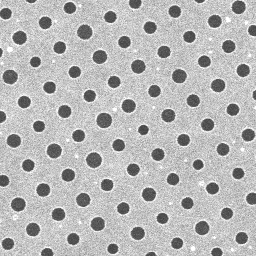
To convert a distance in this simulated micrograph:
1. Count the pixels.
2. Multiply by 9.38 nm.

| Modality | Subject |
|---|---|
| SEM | a regular array of holes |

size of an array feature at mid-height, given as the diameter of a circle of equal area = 0.124 um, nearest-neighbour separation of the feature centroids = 265 nm